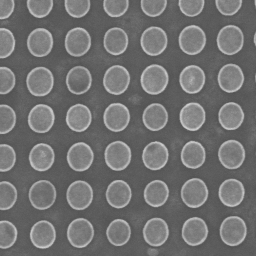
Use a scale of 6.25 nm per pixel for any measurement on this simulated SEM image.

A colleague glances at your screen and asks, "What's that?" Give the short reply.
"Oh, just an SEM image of a regular array of raised bodies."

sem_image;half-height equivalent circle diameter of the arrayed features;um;0.162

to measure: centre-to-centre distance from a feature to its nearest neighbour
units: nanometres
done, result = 235